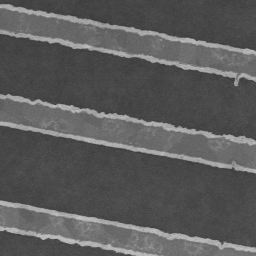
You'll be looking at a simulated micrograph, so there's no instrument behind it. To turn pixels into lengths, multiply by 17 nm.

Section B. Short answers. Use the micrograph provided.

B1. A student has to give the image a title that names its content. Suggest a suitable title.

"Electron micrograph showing one or a few lines or trenches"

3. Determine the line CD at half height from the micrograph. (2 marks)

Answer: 430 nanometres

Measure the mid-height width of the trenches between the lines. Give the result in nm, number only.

1210